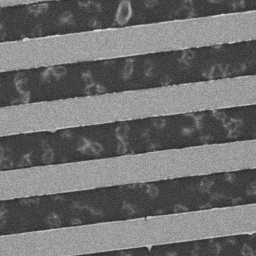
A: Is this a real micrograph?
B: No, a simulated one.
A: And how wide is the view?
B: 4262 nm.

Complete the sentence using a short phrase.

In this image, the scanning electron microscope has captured one or a few lines or trenches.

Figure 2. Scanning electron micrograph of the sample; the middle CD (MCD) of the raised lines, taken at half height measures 466 nanometers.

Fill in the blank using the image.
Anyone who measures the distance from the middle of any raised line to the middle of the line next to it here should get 1.06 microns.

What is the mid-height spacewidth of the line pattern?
592 nm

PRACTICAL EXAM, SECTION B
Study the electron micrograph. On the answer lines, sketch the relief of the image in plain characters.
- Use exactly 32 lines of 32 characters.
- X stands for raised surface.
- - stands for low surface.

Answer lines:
XXX------------X----------------
---------------X---------------X
---------------X-------XXXXXXXXX
---------------XXXXXXXXXXXXXXXXX
-------XXXXXXXXXXXXXXXXXXXXXXXXX
XXXXXXXXXXXXXXXXXXXXXXXXXXX-----
XXXXXXXXXXXXXXXXXXXX------------
XXXXXXXXXXXX--------------------
XXXX----------------------------
-------------------------------X
-----------------------XXXXXXXXX
----------------XXXXXXXXXXXXXXXX
--------XXXXXXXXXXXXXXXXXXXXXXXX
XXXXXXXXXXXXXXXXXXXXXXXXXXX-----
XXXXXXXXXXXXXXXXXXXX------------
XXXXXXXXXXXX--------------------
XXXX----------------------------
-------------------------------X
-----------------------XXXXXXXXX
----------------XXXXXXXXXXXXXXXX
--------XXXXXXXXXXXXXXXXXXXXXXXX
XXXXXXXXXXXXXXXXXXXXXXXXXXX-----
XXXXXXXXXXXXXXXXXXXX------------
XXXXXXXXXXXX--------------------
XXXX----------------------------
--------------------------------
------------------------XXXXXXXX
-----------------XXXXXXXXXXXXXXX
--------XXXXXXXXXXXXXXXXXXXXXXXX
-XXXXXXXXXXXXXXXXXXXXXXXXXXX----
XXXXXXXXXXXXXXXXXXXX------------
XXXXXXXXXXXXX-------------------